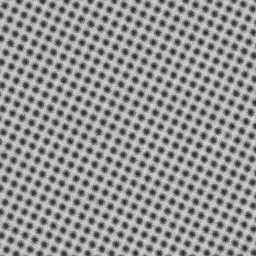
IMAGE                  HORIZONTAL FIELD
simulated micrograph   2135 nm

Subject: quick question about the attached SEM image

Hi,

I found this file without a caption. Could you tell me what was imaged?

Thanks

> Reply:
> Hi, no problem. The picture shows a regular array of holes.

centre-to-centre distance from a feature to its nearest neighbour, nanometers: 86.1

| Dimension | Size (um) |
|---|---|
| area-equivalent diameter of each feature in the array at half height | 0.061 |